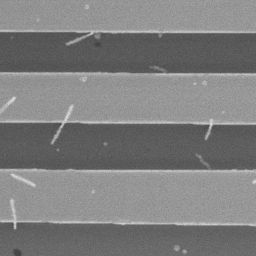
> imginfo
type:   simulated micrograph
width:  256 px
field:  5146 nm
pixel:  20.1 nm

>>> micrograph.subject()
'lines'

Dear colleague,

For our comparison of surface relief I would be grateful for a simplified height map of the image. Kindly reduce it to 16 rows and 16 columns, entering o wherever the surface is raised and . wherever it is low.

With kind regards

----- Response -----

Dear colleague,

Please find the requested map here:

oooooooooooooooo
oooooooooooooooo
................
................
................
oooooooooooooooo
oooooooooooooooo
oooooooooooooooo
................
................
................
oooooooooooooooo
oooooooooooooooo
oooooooooooooooo
................
................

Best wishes